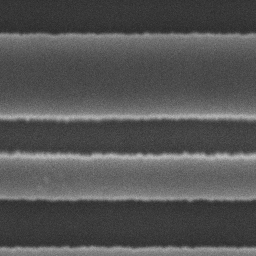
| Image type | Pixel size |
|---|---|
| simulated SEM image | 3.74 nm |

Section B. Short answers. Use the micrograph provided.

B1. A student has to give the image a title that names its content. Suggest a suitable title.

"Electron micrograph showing lines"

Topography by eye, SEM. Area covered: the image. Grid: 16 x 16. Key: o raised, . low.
................
................
oooooooooooooooo
oooooooooooooooo
oooooooooooooooo
oooooooooooooooo
oooooooooooooooo
oooooooooooooooo
oooooooooooooooo
oooooooooooooooo
oooooooooooooooo
oooooooooooooooo
................
................
................
.....o..........